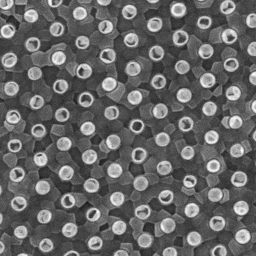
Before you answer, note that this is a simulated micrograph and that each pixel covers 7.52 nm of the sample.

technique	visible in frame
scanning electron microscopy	a regular array of raised bodies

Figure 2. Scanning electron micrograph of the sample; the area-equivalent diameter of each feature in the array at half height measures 97.4 nm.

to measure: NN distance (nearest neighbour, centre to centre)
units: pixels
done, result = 13.7